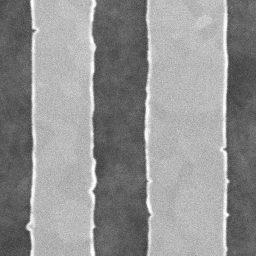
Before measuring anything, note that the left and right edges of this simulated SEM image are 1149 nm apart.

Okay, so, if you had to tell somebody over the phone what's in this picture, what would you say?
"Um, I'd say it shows one or a few lines or trenches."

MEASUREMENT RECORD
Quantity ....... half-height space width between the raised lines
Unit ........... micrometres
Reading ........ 0.246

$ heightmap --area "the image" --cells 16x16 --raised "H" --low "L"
LLHHHHLLLHHHHHLL
LLHHHHLLLHHHHHLL
LLHHHHLLLHHHHHLL
LLHHHHLLLHHHHHLL
LLHHHHLLLHHHHHLL
LLHHHHLLLHHHHHLL
LLHHHHLLLHHHHHLL
LLHHHHLLLHHHHHLL
LLHHHHLLLHHHHHLL
LLHHHHLLLHHHHHLL
LLHHHHLLLHHHHHLL
LLHHHHLLLHHHHHLL
LLHHHHLLLHHHHHLL
LLHHHHLLLHHHHHLL
LLHHHHLLLHHHHHLL
LLHHHHLLLHHHHHLL